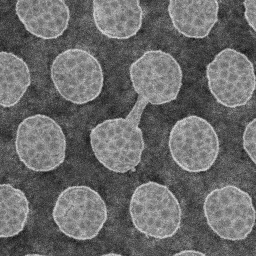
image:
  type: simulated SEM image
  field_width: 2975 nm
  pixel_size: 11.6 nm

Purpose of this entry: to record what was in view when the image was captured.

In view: raised bodies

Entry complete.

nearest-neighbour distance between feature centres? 881 nm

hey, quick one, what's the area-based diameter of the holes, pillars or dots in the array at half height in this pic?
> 594 nm